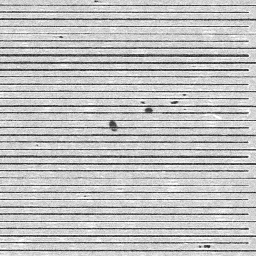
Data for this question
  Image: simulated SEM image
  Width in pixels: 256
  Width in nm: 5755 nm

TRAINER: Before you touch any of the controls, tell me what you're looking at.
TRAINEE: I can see parallel lines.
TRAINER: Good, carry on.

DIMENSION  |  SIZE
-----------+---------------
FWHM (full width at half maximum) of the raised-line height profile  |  115 nm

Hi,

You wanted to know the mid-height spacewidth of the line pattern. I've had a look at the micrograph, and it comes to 42.1 nanometers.